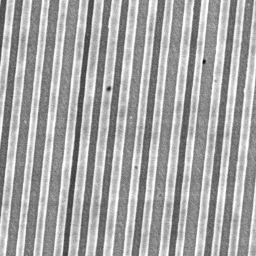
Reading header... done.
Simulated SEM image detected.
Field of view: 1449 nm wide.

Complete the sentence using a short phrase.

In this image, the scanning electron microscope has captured parallel lines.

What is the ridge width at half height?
47.9 nanometres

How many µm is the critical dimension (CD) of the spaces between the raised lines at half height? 0.0521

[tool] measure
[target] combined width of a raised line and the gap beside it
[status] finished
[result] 17.7 px